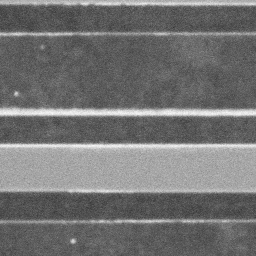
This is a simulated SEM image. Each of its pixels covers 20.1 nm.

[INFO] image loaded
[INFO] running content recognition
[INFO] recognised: lines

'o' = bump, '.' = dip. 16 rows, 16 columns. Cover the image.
................
................
oooooooooooooooo
oooooooooooooooo
oooooooooooooooo
oooooooooooooooo
oooooooooooooooo
................
................
oooooooooooooooo
oooooooooooooooo
oooooooooooooooo
................
................
oooooooooooooooo
oooooooooooooooo